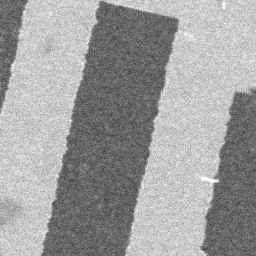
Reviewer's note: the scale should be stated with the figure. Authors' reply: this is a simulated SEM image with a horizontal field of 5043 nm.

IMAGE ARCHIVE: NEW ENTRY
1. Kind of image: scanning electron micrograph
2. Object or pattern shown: one or a few lines or trenches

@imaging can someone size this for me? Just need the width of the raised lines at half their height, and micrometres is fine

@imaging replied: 1.65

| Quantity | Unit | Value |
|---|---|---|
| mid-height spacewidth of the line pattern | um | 1.36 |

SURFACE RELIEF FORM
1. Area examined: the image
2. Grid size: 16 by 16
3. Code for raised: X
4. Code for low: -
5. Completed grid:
XX----XX--------
X-----XXXXX-----
X-----XXXXX-----
X----XXXXXX-----
X----XXXXX------
X----XXXXX------
-----XXXXX----XX
----XXXXXX----XX
----XXXXXX----XX
----XXXXX-----XX
----XXXXX-----XX
----XXXXX----XXX
---XXXXXX----XXX
---XXXXX-----XXX
---XXXXX-----XXX
---XXXXX-----XXX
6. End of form